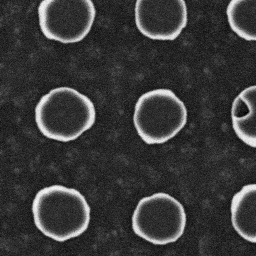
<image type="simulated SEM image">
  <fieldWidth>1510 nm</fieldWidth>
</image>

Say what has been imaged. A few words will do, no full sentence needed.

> raised bodies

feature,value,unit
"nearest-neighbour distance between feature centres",570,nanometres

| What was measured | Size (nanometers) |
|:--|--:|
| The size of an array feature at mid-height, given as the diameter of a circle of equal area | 311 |